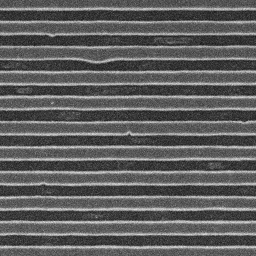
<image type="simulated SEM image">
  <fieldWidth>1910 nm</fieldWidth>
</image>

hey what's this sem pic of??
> parallel lines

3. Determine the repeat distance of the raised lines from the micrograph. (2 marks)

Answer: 0.187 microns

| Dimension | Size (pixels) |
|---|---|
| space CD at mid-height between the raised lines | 11.4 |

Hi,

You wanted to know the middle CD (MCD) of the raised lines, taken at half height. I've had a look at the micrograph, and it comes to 98 nm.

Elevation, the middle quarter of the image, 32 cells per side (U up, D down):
DDDDDDDDDDDDDDDDDDDDDDDDDDDDDDDD
DDDDDDDDDDDDDDDDDDDDDDDDDDDDDDDD
UUUUUUUUUUUUUUUUUUUUUUUUUUUUUUUU
UUUUUUUUUUUUUUUUUUUUUUUUUUUUUUUU
UUUUUUUUUUUUUUUUUUUUUUUUUUUUUUUU
DDDDDDDDDDDDDDDDDDDDDDDDDDDDDDDD
DDDDDDDDDDDDDDDDDDDDDDDDDDDDDDDD
DDDDDDDDDDDDDDDDDDDDDDDDDDDDDDDD
UUUUUUUUUUUUUUUUUUUUUUUUUUUUUUUU
UUUUUUUUUUUUUUUUUUUUUUUUUUUUUUUU
UUUUUUUUUUUUUUUUUUUUUUUUUUUUUUUU
DDDDDDDDDDDDDDDDDDDDDDDDDDDDDDDD
DDDDDDDDDDDDDDDDDDDDDDDDDDDDDDDD
DDDDDDDDDDDDDDDDDDDDDDDDDDDDDDDD
DDDDDDDDDDDDDDDDUUDDDDDDDDDDDDUU
UUUUUUUUUUUUUUUUUUUUUUUUUUUUUUUU
UUUUUUUUUUUUUUUUUUUUUUUUUUUUUUUU
UUUUUUUUUUUUUUUUDUUUUUUUUUUUUUUU
DDDDDDDDDDDDDDDDDDDDDDDDDDDDDDDD
DDDDDDDDDDDDDDDDDDDDDDDDDDDDDDDD
DDDDDDDDDDDDDDDDDDDDDDDDDDDDDDDD
UUUUUUUUUUUUUUUUUUUUUUUUUUUUUUUU
UUUUUUUUUUUUUUUUUUUUUUUUUUUUUUUU
UUUUUUUUUUUUUUUUUUUUUUUUUUUUUUUU
DDDDDDDDDDDDDDDDDDDDDDDDDDDDDDDD
DDDDDDDDDDDDDDDDDDDDDDDDDDDDDDDD
DDDDDDDDDDDDDDDDDDDDDDDDDDDDDDDD
UUUUUUUUUUUUUUUUUUUUUUUUUUUUUUUU
UUUUUUUUUUUUUUUUUUUUUUUUUUUUUUUU
UUUUUUUUUUUUUUUUUUUUUUUUUUUUUUUU
DDDDDDDDDDDDDDDDDDDDDDDDDDDDDDDD
DDDDDDDDDDDDDDDDDDDDDDDDDDDDDDDD